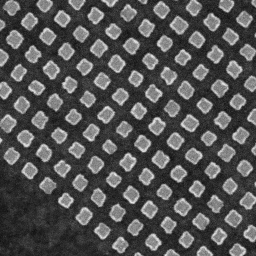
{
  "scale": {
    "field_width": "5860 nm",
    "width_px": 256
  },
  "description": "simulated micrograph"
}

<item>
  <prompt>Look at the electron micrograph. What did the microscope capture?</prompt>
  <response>a regular array of raised bodies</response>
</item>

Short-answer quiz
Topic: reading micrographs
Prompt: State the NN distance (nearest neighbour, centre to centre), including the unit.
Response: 0.522 micrometres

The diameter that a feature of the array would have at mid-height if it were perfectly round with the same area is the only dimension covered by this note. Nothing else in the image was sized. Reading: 0.328 microns